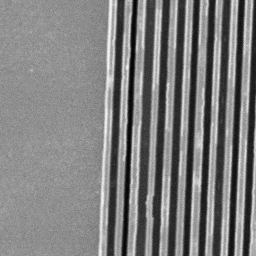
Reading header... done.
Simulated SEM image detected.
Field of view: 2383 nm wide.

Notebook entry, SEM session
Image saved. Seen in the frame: parallel lines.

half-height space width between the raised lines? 7.86 px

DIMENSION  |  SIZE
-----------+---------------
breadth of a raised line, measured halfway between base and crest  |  0.0639 um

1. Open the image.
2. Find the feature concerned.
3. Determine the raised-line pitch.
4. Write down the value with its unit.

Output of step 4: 140 nm